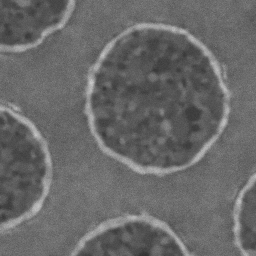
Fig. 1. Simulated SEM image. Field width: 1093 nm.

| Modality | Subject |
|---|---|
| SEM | raised bodies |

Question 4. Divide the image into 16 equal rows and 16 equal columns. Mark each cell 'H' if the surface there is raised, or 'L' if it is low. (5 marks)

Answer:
HHHHLLLLLLLLLLLL
HHHHLLLLLLLLLLLL
HHHLLLLHHHHHLLLL
LLLLLLHHHHHHHLLL
LLLLLLHHHHHHHHLL
LLLLLLHHHHHHHHLL
LLLLLLHHHHHHHHLL
HLLLLLHHHHHHHHLL
HHLLLLHHHHHHHHLL
HHHLLLLHHHHHHLLL
HHHLLLLLLHHLLLLL
HHHLLLLLLLLLLLLL
HHHLLLLLLLLLLLLH
HHLLLLLLLLLLLLLH
LLLLLLHHHHHLLLLH
LLLLLHHHHHHLLLLH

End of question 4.